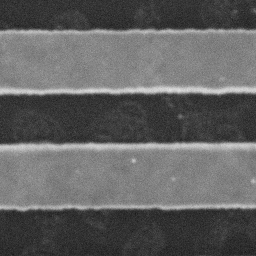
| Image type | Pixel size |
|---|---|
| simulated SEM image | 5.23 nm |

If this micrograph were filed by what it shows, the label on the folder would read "lines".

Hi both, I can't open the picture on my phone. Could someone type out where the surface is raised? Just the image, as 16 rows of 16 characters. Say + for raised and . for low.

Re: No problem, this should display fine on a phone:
................
................
++++++++++++++++
++++++++++++++++
++++++++++++++++
++++++++++++++++
................
................
................
++++++++++++++++
++++++++++++++++
++++++++++++++++
++++++++++++++++
................
................
................